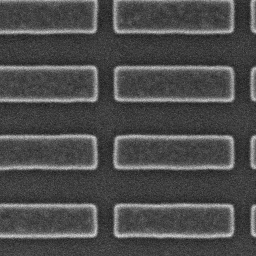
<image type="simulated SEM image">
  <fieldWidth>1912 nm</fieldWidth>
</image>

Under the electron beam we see wiring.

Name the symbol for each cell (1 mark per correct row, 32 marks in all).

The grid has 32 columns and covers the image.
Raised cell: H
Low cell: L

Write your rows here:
HHHHHHHHHHHHLLHHHHHHHHHHHHHHHLLL
HHHHHHHHHHHHLLHHHHHHHHHHHHHHHLLL
HHHHHHHHHHHHLLHHHHHHHHHHHHHHHLLL
HHHHHHHHHHHHLLHHHHHHHHHHHHHHHLLL
LLLLLLLLLLLLLLLLLLLLLLLLLLLLLLLL
LLLLLLLLLLLLLLLLLLLLLLLLLLLLLLLL
LLLLLLLLLLLLLLLLLLLLLLLLLLLLLLLL
LLLLLLLLLLLLLLLLLLLLLLLLLLLLLLLL
HHHHHHHHHHHHLLLHHHHHHHHHHHHHHLLL
HHHHHHHHHHHHLLHHHHHHHHHHHHHHHLLL
HHHHHHHHHHHHLLHHHHHHHHHHHHHHHLLL
HHHHHHHHHHHHLLHHHHHHHHHHHHHHHLLL
HHHHHHHHHHLHLLLLLLLLLHHLHHHHHLLL
LLLLLLLLLLLLLLLLLLLLLLLLLLLLLLLL
LLLLLLLLLLLLLLLLLLLLLLLLLLLLLLLL
LLLLLLLLLLLLLLLLLLLLLLLLLLLLLLLL
LLLLLLLLLLLLLLLLLLLLLLLLLLLLLLLL
HHHHHHHHHHHHLLLHHHHHHHHHHHHHHLLL
HHHHHHHHHHHHLLHHHHHHHHHHHHHHHLLL
HHHHHHHHHHHHLLHHHHHHHHHHHHHHHLLL
HHHHHHHHHHHHLLHHHHHHHHHHHHHHHLLL
LLLLLLLLLLLLLLLLLLLLLLLLLLLLLLLL
LLLLLLLLLLLLLLLLLLLLLLLLLLLLLLLL
LLLLLLLLLLLLLLLLLLLLLLLLLLLLLLLL
LLLLLLLLLLLLLLLLLLLLLLLLLLLLLLLL
LLLLLLLLLLLLLLLLLLLLLLLLLLLLLLLL
HHHHHHHHHHHHLLHHHHHHHHHHHHHHHLLL
HHHHHHHHHHHHLLHHHHHHHHHHHHHHHLLL
HHHHHHHHHHHHLLHHHHHHHHHHHHHHHLLL
HHHHHHHHHHHHLLLHLHLHHHHHHHHHHLLL
LLLLLLLLLLLLLLLLLLLLLLLLLLLLLLLL
LLLLLLLLLLLLLLLLLLLLLLLLLLLLLLLL